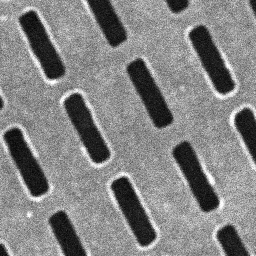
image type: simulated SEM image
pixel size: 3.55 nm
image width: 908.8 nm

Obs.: holes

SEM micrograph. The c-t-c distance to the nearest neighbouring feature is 251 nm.